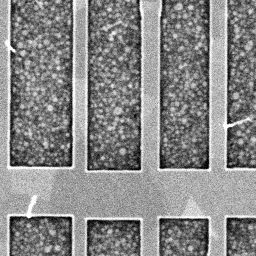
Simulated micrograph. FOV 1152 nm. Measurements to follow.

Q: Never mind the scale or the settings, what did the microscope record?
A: one or a few lines or trenches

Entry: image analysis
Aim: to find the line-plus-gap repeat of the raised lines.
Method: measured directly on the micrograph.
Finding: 310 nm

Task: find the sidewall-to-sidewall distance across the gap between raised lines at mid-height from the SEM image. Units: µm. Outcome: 0.243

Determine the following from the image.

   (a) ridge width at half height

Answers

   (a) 76.4 nanometres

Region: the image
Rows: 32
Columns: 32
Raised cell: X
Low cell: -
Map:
X--------XX-------XX------XX----
X--------XX-------XX------XX----
X--------XX-------XX------XX----
X--------XX-------XX------XX----
X--------XX-------XX------XX----
X--------XX-------XX------XX----
X--------XX-------XX------XX----
X--------XX-------XX------XX----
X--------XX-------XX------XX----
X--------XX-------XX------XX----
X--------XX-------XX------XX----
X--------XX-------XX------XX----
X--------XX-------XX------XX----
X--------XX-------XX------XX----
X--------XX-------XX------XX----
X--------XX-------XX------XX----
X--------XX-------XX------XX----
X--------XX-------XX------XX----
X--------XX-------XX------XX----
X--------XX-------XX------XX----
X--------XX-------XX------XX----
XXXXXXXXXXXXXXXXXXXXXXXXXXXXXXXX
XXXXXXXXXXXXXXXXXXXXXXXXXXXXXXXX
XXXXXXXXXXXXXXXXXXXXXXXXXXXXXXXX
XXXXXXXXXXXXXXXXXXXXXXXXXXXXXXXX
XXXXXXXXXXXXXXXXXXXXXXXXXXXXXXXX
XXXXXXXXXXXXXXXXXXXXXXXXXXXXXXXX
X--------XX------XXX------XX----
X--------XX-------XX------XX----
X--------XX-------XX------XX----
X--------XX-------XX------XX----
X--------XX-------XX------XX----